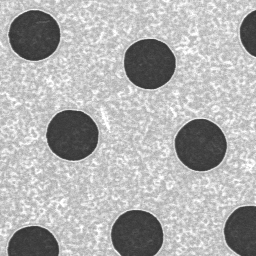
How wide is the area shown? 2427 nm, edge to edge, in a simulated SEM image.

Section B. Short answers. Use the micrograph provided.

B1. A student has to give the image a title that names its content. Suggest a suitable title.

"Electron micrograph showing holes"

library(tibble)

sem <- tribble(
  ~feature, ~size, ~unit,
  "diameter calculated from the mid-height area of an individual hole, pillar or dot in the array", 490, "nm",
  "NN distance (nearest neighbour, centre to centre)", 955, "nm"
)